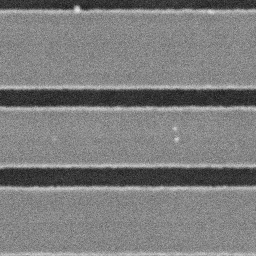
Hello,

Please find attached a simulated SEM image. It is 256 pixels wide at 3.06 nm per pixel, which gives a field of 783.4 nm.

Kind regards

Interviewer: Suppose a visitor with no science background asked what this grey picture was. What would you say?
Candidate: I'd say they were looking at lines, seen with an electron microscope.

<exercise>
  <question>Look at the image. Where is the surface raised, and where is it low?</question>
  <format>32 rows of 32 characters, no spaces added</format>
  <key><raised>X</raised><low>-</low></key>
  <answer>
--------------------------------
XXXXXXXXXXXXXXXXXXXXXXXXXXXXXXXX
XXXXXXXXXXXXXXXXXXXXXXXXXXXXXXXX
XXXXXXXXXXXXXXXXXXXXXXXXXXXXXXXX
XXXXXXXXXXXXXXXXXXXXXXXXXXXXXXXX
XXXXXXXXXXXXXXXXXXXXXXXXXXXXXXXX
XXXXXXXXXXXXXXXXXXXXXXXXXXXXXXXX
XXXXXXXXXXXXXXXXXXXXXXXXXXXXXXXX
XXXXXXXXXXXXXXXXXXXXXXXXXXXXXXXX
XXXXXXXXXXXXXXXXXXXXXXXXXXXXXXXX
XXXXXXXXXXXXXXXXXXXXXXXXXXXXXXXX
--------------------------------
--------------------------------
XXXXXXXXXXXXXXXXXXXXXXXXXXXXXXXX
XXXXXXXXXXXXXXXXXXXXXXXXXXXXXXXX
XXXXXXXXXXXXXXXXXXXXXXXXXXXXXXXX
XXXXXXXXXXXXXXXXXXXXXXXXXXXXXXXX
XXXXXXXXXXXXXXXXXXXXXXXXXXXXXXXX
XXXXXXXXXXXXXXXXXXXXXXXXXXXXXXXX
XXXXXXXXXXXXXXXXXXXXXXXXXXXXXXXX
XXXXXXXXXXXXXXXXXXXXXXXXXXXXXXXX
--------------------------------
--------------------------------
XXXXXXXXXXXXXXXXXXXXXXXXXXXXXXXX
XXXXXXXXXXXXXXXXXXXXXXXXXXXXXXXX
XXXXXXXXXXXXXXXXXXXXXXXXXXXXXXXX
XXXXXXXXXXXXXXXXXXXXXXXXXXXXXXXX
XXXXXXXXXXXXXXXXXXXXXXXXXXXXXXXX
XXXXXXXXXXXXXXXXXXXXXXXXXXXXXXXX
XXXXXXXXXXXXXXXXXXXXXXXXXXXXXXXX
XXXXXXXXXXXXXXXXXXXXXXXXXXXXXXXX
XXXXXXXXXXXXXXXXXXXXXXXXXXXXXXXX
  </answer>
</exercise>